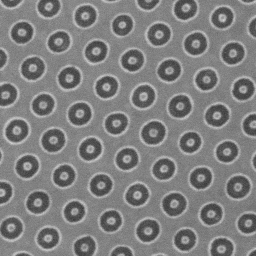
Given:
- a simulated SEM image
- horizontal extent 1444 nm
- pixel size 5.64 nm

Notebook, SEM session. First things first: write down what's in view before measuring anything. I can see a regular array of ring-shaped grooves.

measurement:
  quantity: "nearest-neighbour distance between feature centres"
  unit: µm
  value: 0.209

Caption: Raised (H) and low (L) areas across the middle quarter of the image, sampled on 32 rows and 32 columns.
HLHHHHHHHHHHHHLLLLLLHHHHLLLLLHHH
LLLLHHHHHHHHHHHLLLLHHHHLLLHLLLHH
LLLLHHHHHHHHHHHHHHHHHHHLLLLLLHHH
LHLLHHHHHLLLLHHHHHHHHHHHLLLLHHHH
LLLLHHHHLLLLLLHHHHHHHHHHHHLHHHHH
LLLHHHHHLLHLLLHHHHLLLLHHHHHHHHHH
LHHHHHHHLLLLLLHHHLLLLLLHHHHHHHHH
HHHHHHHHLLLLLHHHHLLHLLLHHHHHHHHH
HHHHHHHHHLLLHHHHHLLHHLLHHHHLLLLH
HHHLLHHHHHHHHHHHHLLLLLLHHHLLLLLL
HHLLLLLHHHHHHHHHHHLLLLHHHHLLHHLL
HLLLLLLHHHHHHHHHHHHHHHHHHHLLLLLL
HLLHHLLHHHHHLLLHHHHHHHHHHHLLLLLH
HLLLLLLHHHLLLLLLHHHHHHHHHHHHLLHH
HLLLLLHHHHLLHHLLHHHHHLLLHHHHHHHH
HHHLLHHHHHLLLLLLHHHHLLLLLHHHHHHH
HHHHHHHHHHLLLLLHHHHLLLHLLLHHHHHH
HHHHHHHHHHHLLLHHHHHLLLHLLLHHHHLL
LHHHHHLLHHHHHHHHHHHLLLLLLHHHHLLL
HHHHLLLLLHHHHHHHHHHHLLLLLHHHHLLH
HHHHLLLLLLHHHHHHHHHHHHHHHHHHHLLL
HHHHLLHLLLHHHHLLLLHHHHHHHHHHHLLL
HHHHLLLLLHHHHLLLLLHHHHHHHHHHHHHH
HHHHLLLLLHHHHLLHHLLHHHHHLLHHHHHH
HHHHHHHHHHHHHLLLLLLHHHHLLLLLHHHH
LLHHHHHHHHHHHLLLLLHHHHLLLLLLHHHH
LLLHHHHHHHHHHHLLLHHHHHLLHHLLHHHH
HLLHHHHHLLHHHHHHHHHHHHLLLLLLHHHH
HLLHHHHLLLLLHHHHHHHHHHHLLLLHHHHL
LLLHHHLLLLLLHHHHHHHHHHHHHHHHHHHL
LLHHHHLLLHLLHHHHLLLLHHHHHHHHHHHH
HHHHHHLLLLLLHHHHLLLLLHHHHHHHHHHH